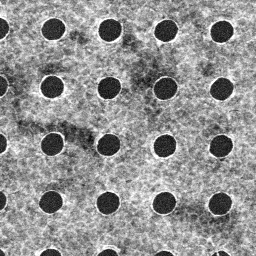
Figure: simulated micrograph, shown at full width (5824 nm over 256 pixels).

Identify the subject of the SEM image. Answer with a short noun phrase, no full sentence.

a regular array of holes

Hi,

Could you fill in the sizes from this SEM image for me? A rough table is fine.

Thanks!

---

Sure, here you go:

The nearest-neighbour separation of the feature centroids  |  1280 nm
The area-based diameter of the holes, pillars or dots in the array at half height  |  541 nanometers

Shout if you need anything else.